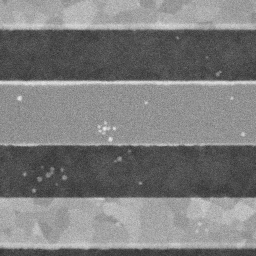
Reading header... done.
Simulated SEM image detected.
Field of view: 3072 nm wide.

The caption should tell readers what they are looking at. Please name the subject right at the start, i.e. lines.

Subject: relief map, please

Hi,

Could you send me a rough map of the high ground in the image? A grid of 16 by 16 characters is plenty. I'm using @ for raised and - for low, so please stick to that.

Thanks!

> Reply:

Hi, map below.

@@@@@@@@@@@@@@@@
@@@@@@@@@@@@@@@@
----------------
----------------
----------------
@@@@@@@@@@@@@@@@
@@@@@@@@@@@@@@@@
@@@@@@@@@@@@@@@@
@@@@@@@@@@@@@@@@
----------------
----------------
----------------
@@@@@@@@@@@@@@@@
@@@@@@@@@@@@@@@@
@@@@@@@@@@@@@@@@
----------------